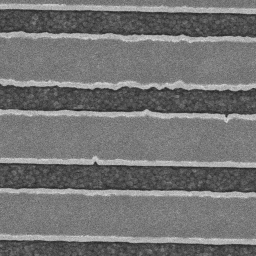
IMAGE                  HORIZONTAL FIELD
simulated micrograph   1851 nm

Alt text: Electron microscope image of one or a few lines or trenches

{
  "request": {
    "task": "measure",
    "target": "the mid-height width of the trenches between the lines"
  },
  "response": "203 nm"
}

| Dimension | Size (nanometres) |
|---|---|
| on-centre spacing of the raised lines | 560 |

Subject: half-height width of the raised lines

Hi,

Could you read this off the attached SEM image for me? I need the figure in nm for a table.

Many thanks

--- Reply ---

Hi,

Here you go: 356